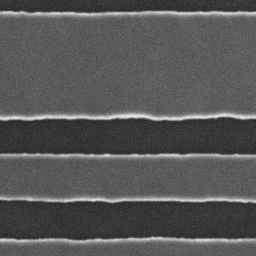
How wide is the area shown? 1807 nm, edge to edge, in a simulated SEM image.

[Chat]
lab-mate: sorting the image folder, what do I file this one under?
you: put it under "lines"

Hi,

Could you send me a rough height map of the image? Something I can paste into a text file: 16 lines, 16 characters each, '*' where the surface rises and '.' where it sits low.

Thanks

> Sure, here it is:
................
****************
****************
****************
****************
****************
****************
................
................
................
****************
****************
****************
................
................
****************